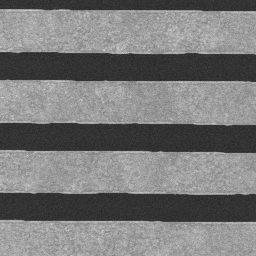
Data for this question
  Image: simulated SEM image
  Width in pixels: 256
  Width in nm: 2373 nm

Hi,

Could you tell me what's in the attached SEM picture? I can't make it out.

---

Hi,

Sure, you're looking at lines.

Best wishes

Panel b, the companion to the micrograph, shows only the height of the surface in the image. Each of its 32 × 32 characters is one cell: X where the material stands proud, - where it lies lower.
--------------------------------
XXXXXXXXXXXXXXXXXXXXXXXXXXXXXXXX
XXXXXXXXXXXXXXXXXXXXXXXXXXXXXXXX
XXXXXXXXXXXXXXXXXXXXXXXXXXXXXXXX
XXXXXXXXXXXXXXXXXXXXXXXXXXXXXXXX
XXXXXXXXXXXXXXXXXXXXXXXXXXXXXXXX
--X----XXXXXXXXXXXXXXXXXXXXXXXXX
--------------------------------
--------------------------------
--------------------------------
XXXXXXXXXXXXXXXXXXXXXXXXXXXXXXXX
XXXXXXXXXXXXXXXXXXXXXXXXXXXXXXXX
XXXXXXXXXXXXXXXXXXXXXXXXXXXXXXXX
XXXXXXXXXXXXXXXXXXXXXXXXXXXXXXXX
XXXXXXXXXXXXXXXXXXXXXXXXXXXXXXXX
------------------------XXXXXXXX
--------------------------------
--------------------------------
--------------------------------
XXXXXXXXXXXXXXXXXXXXXXXXXXXXXXXX
XXXXXXXXXXXXXXXXXXXXXXXXXXXXXXXX
XXXXXXXXXXXXXXXXXXXXXXXXXXXXXXXX
XXXXXXXXXXXXXXXXXXXXXXXXXXXXXXXX
XXXXXXXXXXXXXXXXXXXXXXXXXXXXXXXX
--------------------------------
--------------------------------
--------------------------------
--------------------------------
XXXXXXXXXXXXXXXXXXXXXXXXXXXXXXXX
XXXXXXXXXXXXXXXXXXXXXXXXXXXXXXXX
XXXXXXXXXXXXXXXXXXXXXXXXXXXXXXXX
XXXXXXXXXXXXXXXXXXXXXXXXXXXXXXXX